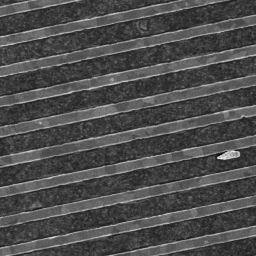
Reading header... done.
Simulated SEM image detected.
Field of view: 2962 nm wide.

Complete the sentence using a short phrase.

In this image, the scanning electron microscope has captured parallel lines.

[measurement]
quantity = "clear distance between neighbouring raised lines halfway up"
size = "228 nanometres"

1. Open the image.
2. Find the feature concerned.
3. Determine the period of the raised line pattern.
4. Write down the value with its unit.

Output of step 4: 342 nm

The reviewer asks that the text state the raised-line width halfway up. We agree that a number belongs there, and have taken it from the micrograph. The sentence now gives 113 nm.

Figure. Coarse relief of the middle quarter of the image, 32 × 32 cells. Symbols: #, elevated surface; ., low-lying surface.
.......................#########
..................###########...
.............############.......
........############............
...############.................
##########......................
#####.........................##
.........................#######
....................############
...............############.....
..........#############.........
.....############...............
############....................
#######.........................
##..........................####
.......................#########
..................############..
.............############.......
........############............
...############.................
##########......................
#####.........................##
.......#.................#######
.......##...........############
.........#.....############.....
..........############..........
......###########...............
..###########...........#.......
#######................###......
###.........................####
.......................#########
..................############..